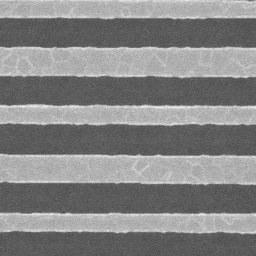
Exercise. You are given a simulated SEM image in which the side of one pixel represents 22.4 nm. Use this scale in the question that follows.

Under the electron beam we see lines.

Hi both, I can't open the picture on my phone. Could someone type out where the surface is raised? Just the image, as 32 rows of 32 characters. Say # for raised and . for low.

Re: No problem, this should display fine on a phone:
################################
################################
................................
................................
................................
................................
################################
################################
################################
...#.....#######################
................................
................................
................................
################################
################################
....##...#####..#######.##.#####
................................
................................
................................
##################.##....#..##..
################################
################################
################################
................................
................................
................................
................................
################################
################################
................................
................................
................................